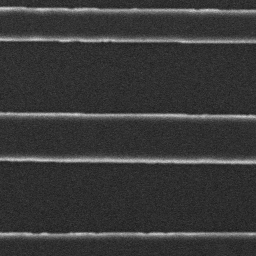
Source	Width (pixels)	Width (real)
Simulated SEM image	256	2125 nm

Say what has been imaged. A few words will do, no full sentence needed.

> lines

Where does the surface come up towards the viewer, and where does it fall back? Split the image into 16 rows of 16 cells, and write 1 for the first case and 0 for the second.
1100000000000000
1111111111111111
1111111111111111
0000000000000000
0000000000000000
0000000000000000
0000000000000000
1111111111111111
1111111111111111
1111111111111111
0000000000000000
0000000000000000
0000000000000000
0000000000000000
0000000000000000
1111111111111111